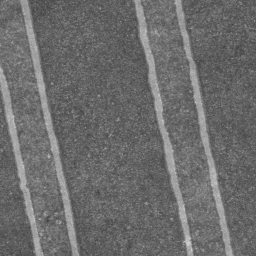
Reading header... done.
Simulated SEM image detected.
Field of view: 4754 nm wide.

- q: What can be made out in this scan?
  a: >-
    one or a few lines or trenches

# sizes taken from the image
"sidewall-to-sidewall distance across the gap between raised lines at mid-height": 2060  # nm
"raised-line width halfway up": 0.7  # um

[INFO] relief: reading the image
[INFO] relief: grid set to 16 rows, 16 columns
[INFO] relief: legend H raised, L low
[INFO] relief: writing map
HHLLLLLLLHHLLLLL
HHLLLLLLLHHLLLLL
HHLLLLLLLHHHLLLL
HHLLLLLLLHHHLLLL
HHLLLLLLLLHHLLLL
HHHLLLLLLLHHLLLL
HHHLLLLLLLHHLLLL
LHHLLLLLLLHHHLLL
LHHLLLLLLLHHHLLL
LHHLLLLLLLLHHLLL
LHHHLLLLLLLHHLLL
LHHHLLLLLLLHHLLL
LLHHLLLLLLLHHHLL
LLHHLLLLLLLHHHLL
LLHHLLLLLLLLHHLL
LLHHHLLLLLLLHHLL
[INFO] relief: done